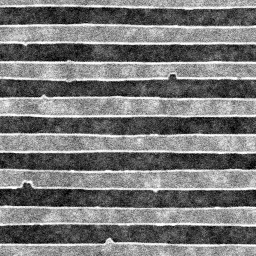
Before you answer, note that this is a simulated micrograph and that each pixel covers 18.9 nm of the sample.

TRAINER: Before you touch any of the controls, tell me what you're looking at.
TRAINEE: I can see parallel lines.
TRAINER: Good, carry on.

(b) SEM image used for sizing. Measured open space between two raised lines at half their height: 19.6 px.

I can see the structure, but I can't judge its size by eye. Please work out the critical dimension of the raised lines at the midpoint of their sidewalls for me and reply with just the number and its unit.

0.316 µm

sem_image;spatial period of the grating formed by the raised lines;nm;685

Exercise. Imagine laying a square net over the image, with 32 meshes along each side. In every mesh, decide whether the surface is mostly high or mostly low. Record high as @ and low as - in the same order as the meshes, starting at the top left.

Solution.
@@@@@@@@@@@@@@@@@@@@@@@@@@@@@@@@
--------------------------------
--------------------------------
@@@@@@@@@@@@@@@@@@@@@@@@@@@@--@@
@@@@@@@@@@@@@@@@@@@@@@@@@@@@@@@@
--------------------------------
--------------------------------
--------------------------------
@@@@@@@@@@@@@@@@@@@@@@@@@@@@@@@@
@@@@@@@@@@@@@@@@@@@@@-@@@@@@@@@@
--------------------------------
--------------------------------
@@@@@@@@@@@@@@@@@@@@@@@@@@@@@@@@
@@@@@@@@@@@@@@@@@@@@@@@@@@@@@@@@
----------------@@@@-@@@@@@@----
--------------------------------
--------------------------------
@@@@@@@@@@@@@@@@@@@@@@@@@@@@@@@@
@@@@@@@@@@@@@@@@@@@@@@@@@@@@@@@@
--------------------------------
--------------------------------
@@@@@@@@@@@-@@@@@@@@@@@@@@@@@@@@
@@@@@@@@@@@@@@@@@@@@@@@@@@@@@@@@
---------@@@@@@@@@@@@@@@@@@@@@@@
--------------------------------
--------------------------------
@@@@@@@@@@@@@@@@@@@@@@@@@@@@@@@@
@@@@@@@@@@@@@@@@@@@@@@@@@@@@@@@@
--------------------------------
--------------------------------
-------------@@@@@--------------
@@@@@@@@@@@@@@@@@@@@@@@@@@@@@@@@